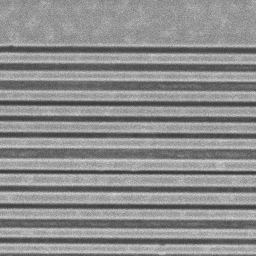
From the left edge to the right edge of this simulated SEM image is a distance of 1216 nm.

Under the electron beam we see parallel lines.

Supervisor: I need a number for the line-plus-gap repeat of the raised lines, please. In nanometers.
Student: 82.2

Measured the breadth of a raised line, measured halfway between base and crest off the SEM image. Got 49.9 nm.